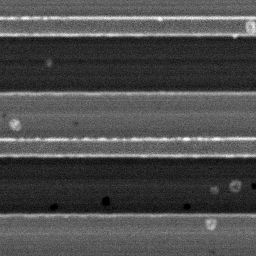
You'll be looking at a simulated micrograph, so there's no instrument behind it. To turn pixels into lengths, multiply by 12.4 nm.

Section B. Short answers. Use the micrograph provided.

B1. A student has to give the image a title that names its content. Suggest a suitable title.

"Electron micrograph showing lines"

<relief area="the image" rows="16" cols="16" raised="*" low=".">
****************
****************
................
................
................
................
****************
****************
****************
****************
................
................
................
****************
****************
****************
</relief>